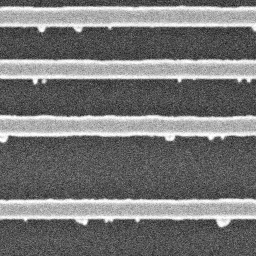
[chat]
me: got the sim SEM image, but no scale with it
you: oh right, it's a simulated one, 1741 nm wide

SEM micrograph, lines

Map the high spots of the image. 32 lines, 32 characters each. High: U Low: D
DDDDDDDDDDDDDDDDDDDDDDDDDDDDDDDD
UUUUUUUUUUUUUUUUUUUUUUUUUUUUUUUU
UUUUUUUUUUUUUUUUUUUUUUUUUUUUUUUU
DDDDDDDDDDDDDDDDDDDDDDDDDDDDDDDD
DDDDDDDDDDDDDDDDDDDDDDDDDDDDDDDD
DDDDDDDDDDDDDDDDDDDDDDDDDDDDDDDD
DDDDDDDDDDDDDDDDDDDDDDDDDDDDDDDD
DDDDDDDDDDDDDDDDDDDDDDDDDDDDDDDD
UUUUUUUUUUUUUUUUUUUUUUUUUUUUUUUU
UUUUUUUUUUUUUUUUUUUUUUUUUUUUUUUU
DDDDDDDDDDDDDDDDDDDDDDDDDDDDDDDD
DDDDDDDDDDDDDDDDDDDDDDDDDDDDDDDD
DDDDDDDDDDDDDDDDDDDDDDDDDDDDDDDD
DDDDDDDDDDDDDDDDDDDDDDDDDDDDDDDD
UUDDUUUDDDDDDUUDDDUUDDDDDDDDDDDD
UUUUUUUUUUUUUUUUUUUUUUUUUUUUUUUU
UUUUUUUUUUUUUUUUUUUUUUUUUUUUUUUU
DDDDDDDDDDDDDDDDDDDDDDDDDDDDDDDD
DDDDDDDDDDDDDDDDDDDDDDDDDDDDDDDD
DDDDDDDDDDDDDDDDDDDDDDDDDDDDDDDD
DDDDDDDDDDDDDDDDDDDDDDDDDDDDDDDD
DDDDDDDDDDDDDDDDDDDDDDDDDDDDDDDD
DDDDDDDDDDDDDDDDDDDDDDDDDDDDDDDD
DDDDDDDDDDDDDDDDDDDDDDDDDDDDDDDD
DDDDDDDDDDDDDDDDDDDDDDDDDDDDDDDD
UUUUUUUUUUUUUUUUUUUUUUUUUUUUUUUU
UUUUUUUUUUUUUUUUUUUUUUUUUUUUUUUU
DDDDDDDDDDDDDDDDDDDDDDDDDDDDDDDD
DDDDDDDDDDDDDDDDDDDDDDDDDDDDDDDD
DDDDDDDDDDDDDDDDDDDDDDDDDDDDDDDD
DDDDDDDDDDDDDDDDDDDDDDDDDDDDDDDD
DDDDDDDDDDDDDDDDDDDDDDDDDDDDDDDD